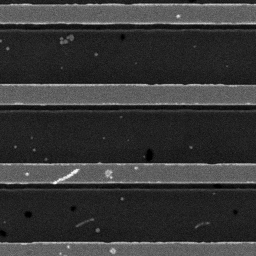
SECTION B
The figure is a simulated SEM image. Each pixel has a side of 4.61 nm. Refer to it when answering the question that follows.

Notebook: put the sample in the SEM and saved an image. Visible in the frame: lines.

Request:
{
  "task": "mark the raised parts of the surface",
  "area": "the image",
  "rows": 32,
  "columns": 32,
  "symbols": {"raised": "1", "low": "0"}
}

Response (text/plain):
00000000000000000000000000000000
11111111111111111111111111111111
11111111111111111111111111111111
00000000000000000000000000000000
00000000000000000000000000000000
00000000000000000000000000000000
00000000000000000000000000000000
00000000000000000000000000000000
00000000000000000000000000000000
00000000000000000000000000000000
00000000000000000000000000000000
11111111111111111111111111111111
11111111111111111111111111111111
00000000000000000000000000000000
00000000000000000000000000000000
00000000000000000000000000000000
00000000000000000000000000000000
00000000000000000000000000000000
00000000000000000000000000000000
00000000000000000000000000000000
00000000000010000000000000000000
11111111111111111111111111111111
11111111111111111111111111111111
00000000000000000000000000000000
00000000000000000000000000000000
00000000000000000000000000000000
00000000000000000000000000000000
00000000000000000000000000000000
00000000000000000000000000000000
00000000000000000000000000000000
11111111111111111111111111111111
11111111111111111111111111111111